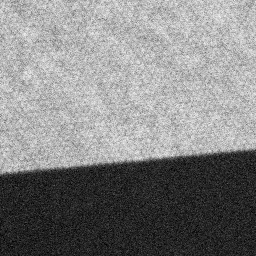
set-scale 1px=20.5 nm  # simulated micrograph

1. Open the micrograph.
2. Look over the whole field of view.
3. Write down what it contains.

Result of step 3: a regular array of raised bodies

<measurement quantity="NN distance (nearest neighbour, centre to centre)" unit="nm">120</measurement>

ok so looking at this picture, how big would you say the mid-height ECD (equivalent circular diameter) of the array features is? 69.4 nm